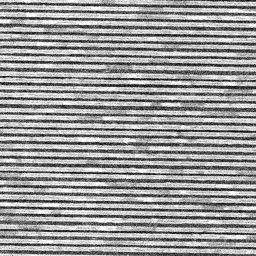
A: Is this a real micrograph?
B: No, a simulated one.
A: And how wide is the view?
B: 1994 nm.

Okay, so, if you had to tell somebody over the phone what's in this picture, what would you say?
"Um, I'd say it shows parallel lines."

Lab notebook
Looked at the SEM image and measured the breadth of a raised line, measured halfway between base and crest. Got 27.3 nm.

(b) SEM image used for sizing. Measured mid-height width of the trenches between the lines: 27.3 nm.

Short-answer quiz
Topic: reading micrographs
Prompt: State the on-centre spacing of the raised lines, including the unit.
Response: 56.9 nm